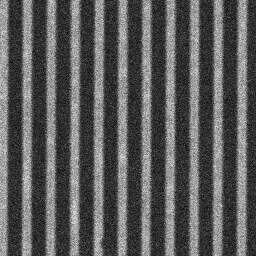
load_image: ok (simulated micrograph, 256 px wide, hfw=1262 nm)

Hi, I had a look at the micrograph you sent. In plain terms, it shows parallel lines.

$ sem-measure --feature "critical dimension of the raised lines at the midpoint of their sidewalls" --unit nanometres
32.7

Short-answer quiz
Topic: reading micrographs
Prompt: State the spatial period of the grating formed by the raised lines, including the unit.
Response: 118 nanometers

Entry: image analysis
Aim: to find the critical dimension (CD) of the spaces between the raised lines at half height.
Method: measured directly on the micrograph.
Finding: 84.4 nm